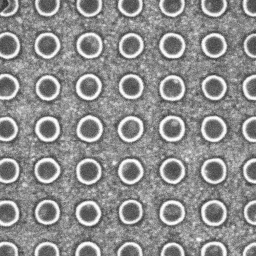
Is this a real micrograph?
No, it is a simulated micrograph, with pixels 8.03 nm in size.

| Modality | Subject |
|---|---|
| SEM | a regular array of raised bodies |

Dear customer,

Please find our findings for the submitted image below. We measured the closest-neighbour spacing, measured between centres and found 0.33 um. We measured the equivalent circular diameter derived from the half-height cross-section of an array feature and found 0.185 microns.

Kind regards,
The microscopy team